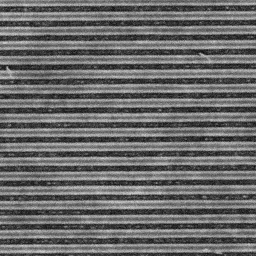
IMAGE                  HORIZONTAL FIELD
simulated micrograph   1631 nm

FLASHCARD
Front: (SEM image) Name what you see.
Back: parallel lines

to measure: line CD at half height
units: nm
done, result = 44.6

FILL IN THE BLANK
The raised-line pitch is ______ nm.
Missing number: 92.4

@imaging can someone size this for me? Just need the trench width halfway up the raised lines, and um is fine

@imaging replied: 0.0509